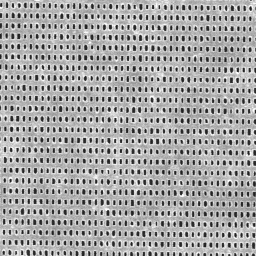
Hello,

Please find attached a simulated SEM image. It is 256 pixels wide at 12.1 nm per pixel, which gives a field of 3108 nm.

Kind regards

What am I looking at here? a regular array of holes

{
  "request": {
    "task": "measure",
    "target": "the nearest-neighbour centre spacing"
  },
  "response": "0.0729 micrometres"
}